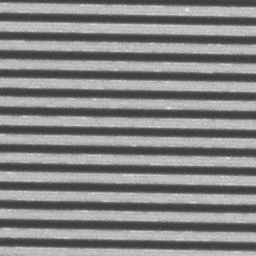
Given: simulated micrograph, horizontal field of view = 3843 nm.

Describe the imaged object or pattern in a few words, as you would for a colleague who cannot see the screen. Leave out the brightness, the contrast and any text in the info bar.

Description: parallel lines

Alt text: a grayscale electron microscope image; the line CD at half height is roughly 173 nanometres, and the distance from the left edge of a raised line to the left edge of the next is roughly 282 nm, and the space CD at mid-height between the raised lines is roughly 0.111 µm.